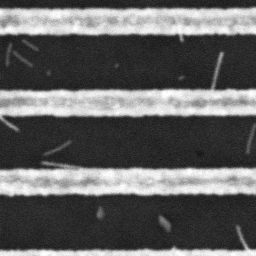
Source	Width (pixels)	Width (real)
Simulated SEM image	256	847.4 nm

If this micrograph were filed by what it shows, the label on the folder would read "lines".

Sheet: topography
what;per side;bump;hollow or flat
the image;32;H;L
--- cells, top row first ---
LLLLLLLLLLLLLLLLLLLLLLLLLLLLLLLL
HHHHHHHHHHHHHHHHHHHHHHHHLHHHHHHH
HHHHHHHHHHHHHHHHHHHHHHHHHHHHHHHH
HHHHHHHHHHHHHHHHHHHHHHHHHHHHHHHH
LLLLLLLLLLLLLLLLLLLLLLLLLLLLLLLL
LLLLLLLLLLLLLLLLLLLLLLLLLLLLLLLL
LLLLLLLLLLLLLLLLLLLLLLLLLLLLLLLL
LLLLLLLLLLLLLLLLLLLLLLLLLLLLLLLL
LLLLLLLLLLLLLLLLLLLLLLLLLLLLLLLL
LLLLLLLLLLLLLLLLLLLLLLLLLLLLLLLL
LLLLLLLLLLLLLLLLLLLLLLLLLLLLLLLL
LLLLLLHHLLLLHHHLLLLHLLLLLLHLHLLL
HHHHHHHHHHHHHHHHHHHHHHHHHHHHHHHH
HHHHHHHHHHHHHHHHHHHHHHHHHHHHHHHH
LLLLLLLLLLLLLLLLLLLLLLLLLLLLLLLL
LLLLLLLLLLLLLLLLLLLLLLLLLLLLLLLL
LLLLLLLLLLLLLLLLLLLLLLLLLLLLLLLL
LLLLLLLLLLLLLLLLLLLLLLLLLLLLLLLL
LLLLLLLLLLLLLLLLLLLLLLLLLLLLLLLL
LLLLLLLLLLLLLLLLLLLLLLLLLLLLLLLL
LLLLLLLLLLLLLLLLLLLLLLLLLLLLLLLL
HHHHHHHHLLHHHHHLHHHHHHHHHHHHHHHH
HHHHHHHHHHHHHHHHHHHHHHHHHHHHHHHH
HHHHHHHHHHHHHHHHHHHHHHHHHHHHHHHH
LLLLLLLLLLLLLLLLLLLLLLLLLLLLLLLL
LLLLLLLLLLLLLLLLLLLLLLLLLLLLLLLL
LLLLLLLLLLLLLLLLLLLLLLLLLLLLLLLL
LLLLLLLLLLLLLLLLLLLLLLLLLLLLLLLL
LLLLLLLLLLLLLLLLLLLLLLLLLLLLLLLL
LLLLLLLLLLLLLLLLLLLLLLLLLLLLLLLL
LLLLLLLLLLLLLLLLLLLLLLLLLLLLLLLL
LLLLLLLLLLLLLLLLLLLLLHLLLLLLLLLH